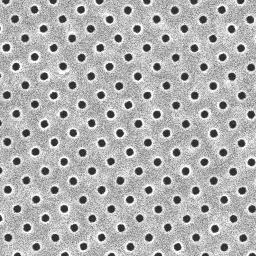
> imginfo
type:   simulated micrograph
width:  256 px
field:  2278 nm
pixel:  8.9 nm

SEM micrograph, a regular array of holes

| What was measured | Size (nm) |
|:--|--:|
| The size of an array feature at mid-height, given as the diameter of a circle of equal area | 73.1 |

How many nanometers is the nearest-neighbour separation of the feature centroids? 184